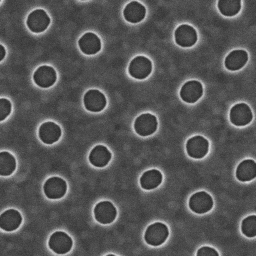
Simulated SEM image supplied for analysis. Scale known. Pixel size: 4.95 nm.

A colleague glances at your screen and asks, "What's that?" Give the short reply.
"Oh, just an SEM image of a regular array of holes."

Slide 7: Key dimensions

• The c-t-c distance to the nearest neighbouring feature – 54.7 pixels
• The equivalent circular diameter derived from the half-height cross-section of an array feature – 23.2 pixels